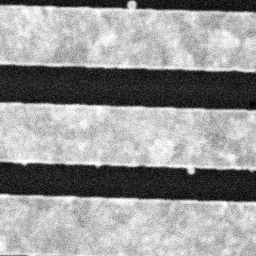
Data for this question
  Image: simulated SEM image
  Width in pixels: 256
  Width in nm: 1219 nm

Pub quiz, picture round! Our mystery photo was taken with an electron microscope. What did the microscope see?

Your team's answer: lines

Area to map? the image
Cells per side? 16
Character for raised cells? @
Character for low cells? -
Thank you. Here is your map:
@@@@------------
@@@@@@@@@@@@@@@@
@@@@@@@@@@@@@@@@
@@@@@@@@@@@@@@@@
----------------
----------------
@@--------------
@@@@@@@@@@@@@@@@
@@@@@@@@@@@@@@@@
@@@@@@@@@@@@@@@@
-------------@@@
----------------
@@@@@@@@@-------
@@@@@@@@@@@@@@@@
@@@@@@@@@@@@@@@@
@@@@@@@@@@@@@@@@